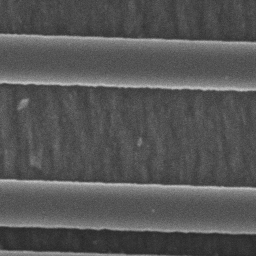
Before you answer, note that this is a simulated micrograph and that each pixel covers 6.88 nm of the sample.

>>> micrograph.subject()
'lines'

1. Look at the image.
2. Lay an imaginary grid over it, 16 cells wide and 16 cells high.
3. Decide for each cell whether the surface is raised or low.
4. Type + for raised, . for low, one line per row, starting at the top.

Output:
................
................
+++++++++++.....
++++++++++++++++
++++++++++++++++
..........++++++
................
................
................
................
................
+++++++++.......
++++++++++++++++
++++++++++++++++
............++++
................